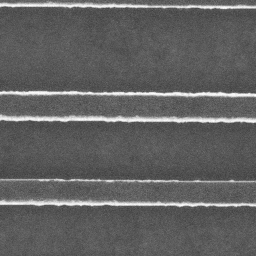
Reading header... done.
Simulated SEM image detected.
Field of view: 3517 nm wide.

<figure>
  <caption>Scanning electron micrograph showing lines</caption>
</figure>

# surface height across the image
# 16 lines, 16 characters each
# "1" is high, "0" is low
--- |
0000000000000000
0000000000000000
0000000000000000
0000000000000000
0000000000000000
0000000000000000
1111111111111111
1111111111111111
0000000000000000
0000000000000000
0000000000000000
1111111111111111
1111111111111111
0000000000000000
0000000000000000
0000000000000000